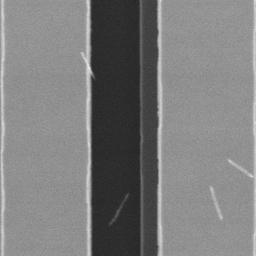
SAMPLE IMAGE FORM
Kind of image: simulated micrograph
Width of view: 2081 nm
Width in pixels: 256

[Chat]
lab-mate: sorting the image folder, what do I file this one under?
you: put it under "lines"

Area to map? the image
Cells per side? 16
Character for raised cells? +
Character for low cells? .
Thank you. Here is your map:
++++++....++++++
++++++....++++++
++++++....++++++
++++++....++++++
++++++....++++++
++++++....++++++
++++++....++++++
++++++....++++++
++++++....++++++
++++++....++++++
++++++....++++++
++++++....++++++
++++++....++++++
++++++....++++++
++++++....++++++
++++++....++++++